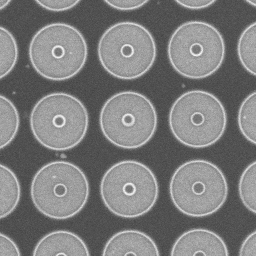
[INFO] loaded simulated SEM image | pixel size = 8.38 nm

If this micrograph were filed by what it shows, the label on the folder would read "an array of small figures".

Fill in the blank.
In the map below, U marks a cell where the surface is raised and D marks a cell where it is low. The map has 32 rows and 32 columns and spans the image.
DUUUUDDDDUUUUUDDDDUUUUUDDDUUUUUU
UUUUUUUUUUUUUUUUUUUUUUUUUUUUUUUU
UUUUUUUUUUUUUUUUUUUUUUUUUUUUUUUU
UUUUUUDDDUUUUUDDDDUUUUUDDDDUUUUD
DUUUUDDDDDUUUDDDDDDUUUDDDDDUUUDD
DDUUDDDDDDDUUDDDDDDUUDDDDDDDUUDD
DDUUDDDUDDDUDDDUUDDUUDDDUDDDUUDD
DDUUDDDDDDDUUDDDDDDUUDDDDDDDUUDD
DUUUUDDDDDUUUDDDDDUUUUDDDDDUUUUD
UUUUUUDDDUUUUUUDDUUUUUUUDUUUUUUU
UUUUUUUUUUUUUUUUUUUUUUUUUUUUUUUU
UUUUUUUUUUUUUUUUUUUUUUUUUUUUUUUU
DUUUUDDDDUUUUUDDDDUUUUDDDDDUUUUD
DDUUDDDDDDUUUDDDDDDUUUDDDDDDUUDD
DDUUDDDUDDDUUDDDDDDUUDDDUDDDUUDD
DDUUDDDUDDDUUDDDDDDUUDDDUDDDUUDD
DDUUDDDDDDDUUDDDDDDUUUDDDDDDUUDD
DUUUUDDDDDUUUUDDDDUUUUUDDDDUUUUD
UUUUUUUDUUUUUUUUUUUUUUUUUUUUUUUU
UUUUUUUUUUUUUUUUUUUUUUUUUUUUUUUU
UUUUUUDDUUUUUUUDDUUUUUUUDDUUUUUU
DUUUUDDDDDUUUUDDDDDUUUDDDDDUUUUD
DDUUDDDDDDDUUDDDDDDUUUDDDDDDUUDD
DDUUDDDUDDDUUDDDUDDDUDDDUUDDUUDD
DDUUDDDDDDDUUDDDDDDUUUDDDDDDUUDD
DDUUUDDDDDUUUDDDDDDUUUDDDDDDUUUD
DUUUUDDDDUUUUUDDDDUUUUUDDDUUUUUU
UUUUUUUUUUUUUUUUUUUUUUUUUUUUUUUU
UUUUUUUUUUUUUUUUUUUUUUUUUUUUUUUU
UUUUUUDDDUUUUUDDDDUUUUUDDDDUUUUD
DDUUUDDDDDUUUUDDDDDUUUDDDDDDUUUD
DDUUDDDDDDDUUDDDDDDDUUDDDDDDUUDD